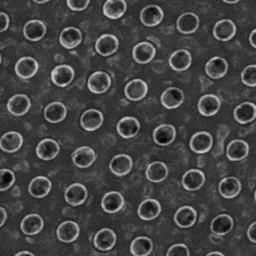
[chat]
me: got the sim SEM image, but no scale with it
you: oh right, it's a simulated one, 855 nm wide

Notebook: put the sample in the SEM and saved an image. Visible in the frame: a regular array of raised bodies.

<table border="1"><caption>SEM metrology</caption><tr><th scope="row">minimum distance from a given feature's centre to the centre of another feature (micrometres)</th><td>0.124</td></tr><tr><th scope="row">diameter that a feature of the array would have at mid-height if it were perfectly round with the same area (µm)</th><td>0.0683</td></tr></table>